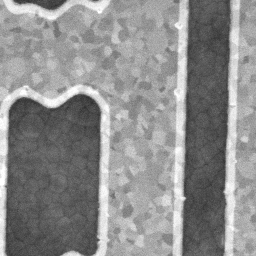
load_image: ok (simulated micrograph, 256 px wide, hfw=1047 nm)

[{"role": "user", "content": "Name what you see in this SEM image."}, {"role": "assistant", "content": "one or a few lines or trenches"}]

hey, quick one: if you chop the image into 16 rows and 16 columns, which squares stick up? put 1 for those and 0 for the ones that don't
1000111111100001
1111111111100001
1111111111100001
1111111111100001
1111111111100001
1111111111100001
0000001111100001
0000000111100001
0000000111100001
0000000111100001
0000000111100011
0000000111100011
0000000111100011
0000000111100011
0000001111100011
0000001111100011